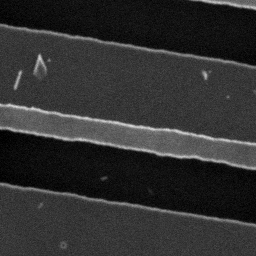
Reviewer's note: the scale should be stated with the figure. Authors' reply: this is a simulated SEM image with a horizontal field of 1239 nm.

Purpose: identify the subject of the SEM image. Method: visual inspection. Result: lines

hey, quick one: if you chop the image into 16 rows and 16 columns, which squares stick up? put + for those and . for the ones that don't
................
................
++++++..........
++++++++++++....
++++++++++++++++
++++++++++++++++
++++++++++++++++
++++++++++++++++
...+++++++++++++
.........+++++++
...............+
................
++++++..........
+++++++++++++...
++++++++++++++++
++++++++++++++++